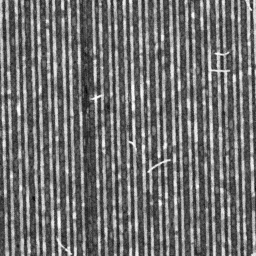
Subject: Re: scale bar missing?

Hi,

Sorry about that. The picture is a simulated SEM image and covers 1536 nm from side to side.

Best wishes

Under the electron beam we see parallel lines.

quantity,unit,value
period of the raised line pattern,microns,0.0464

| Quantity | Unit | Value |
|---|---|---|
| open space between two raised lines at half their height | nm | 27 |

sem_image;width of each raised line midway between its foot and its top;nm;13.5